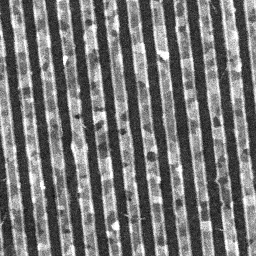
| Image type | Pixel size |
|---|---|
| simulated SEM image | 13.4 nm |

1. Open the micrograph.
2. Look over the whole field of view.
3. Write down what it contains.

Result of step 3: parallel lines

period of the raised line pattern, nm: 313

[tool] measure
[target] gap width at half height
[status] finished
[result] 180 nanometers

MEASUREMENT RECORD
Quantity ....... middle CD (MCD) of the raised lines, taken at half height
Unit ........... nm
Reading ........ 123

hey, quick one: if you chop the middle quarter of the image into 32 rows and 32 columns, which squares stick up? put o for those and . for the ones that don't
ooo...ooo...oo....oo....oo....oo
.oo...ooo...oo....oo....oo....oo
.oo...ooo...oo....oo....oo....oo
.oo...ooo...ooo...ooo...oo....oo
.oo....oo...ooo...ooo...ooo...oo
.oo....oo....oo...ooo...ooo...oo
.oo....oo....oo....oo...ooo...oo
.oo....ooo...oo....oo....oo...oo
.oo....ooo...oo....oo....oo....o
.ooo...ooo...oo....oo....oo....o
.ooo...ooo...ooo...oo....oo....o
..oo...ooo...ooo...ooo...oo....o
..oo....oo...ooo...ooo...ooo...o
..oo....oo....oo...ooo...ooo...o
..oo....oo....oo....oo...ooo...o
..ooo...oo....oo....oo....oo...o
..oo....oo....oo....oo....oo...o
..ooo...oo....oo....oo....oo....
..ooo...ooo...oo....oo....oo....
..ooo...ooo...ooo...oo....oo....
..ooo...ooo...ooo...ooo...oo....
..ooo....oo...ooo...ooo...oo....
...oo....oo....oo...ooo...oo....
...oo....oo....oo....oo...ooo...
...oo....oo....oo....oo....oo...
...ooo...oo....oo....oo....oo...
...ooo...ooo...oo....oo....oo...
....oo...ooo...oo....ooo...oo...
....oo....oo...oo....ooo...oo...
....oo....oo...ooo...ooo...oo...
....oo....oo...ooo...ooo...ooo..
....oo....oo....oo...ooo...ooo..